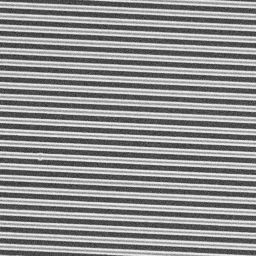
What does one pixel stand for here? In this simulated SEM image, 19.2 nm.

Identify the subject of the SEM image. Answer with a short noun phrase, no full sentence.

parallel lines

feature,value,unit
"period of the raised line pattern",221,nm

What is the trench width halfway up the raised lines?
7.62 pixels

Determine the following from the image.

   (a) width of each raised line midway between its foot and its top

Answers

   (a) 74.4 nm